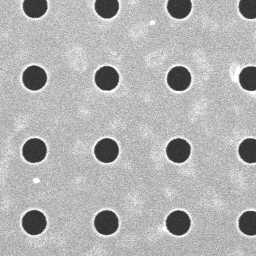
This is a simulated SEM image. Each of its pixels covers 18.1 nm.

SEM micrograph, a regular array of holes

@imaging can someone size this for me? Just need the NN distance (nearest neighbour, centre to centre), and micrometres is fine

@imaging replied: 1.3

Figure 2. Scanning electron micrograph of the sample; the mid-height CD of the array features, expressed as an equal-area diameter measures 25.5 px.